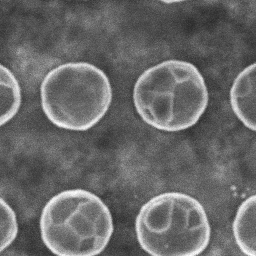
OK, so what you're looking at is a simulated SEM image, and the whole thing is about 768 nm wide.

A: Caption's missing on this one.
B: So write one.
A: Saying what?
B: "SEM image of raised bodies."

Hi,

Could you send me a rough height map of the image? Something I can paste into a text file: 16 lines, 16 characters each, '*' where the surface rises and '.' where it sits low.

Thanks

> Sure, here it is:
................
................
................
................
...***...***...*
*..****.*****..*
*..****.*****..*
...***...***...*
................
................
................
................
...***....**....
*..****..****..*
*..****..****..*
...***...****..*